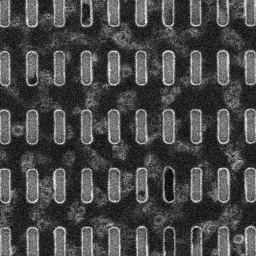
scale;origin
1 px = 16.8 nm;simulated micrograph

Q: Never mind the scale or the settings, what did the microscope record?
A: a regular array of holes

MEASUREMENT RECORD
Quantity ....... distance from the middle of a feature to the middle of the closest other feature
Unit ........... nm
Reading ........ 456